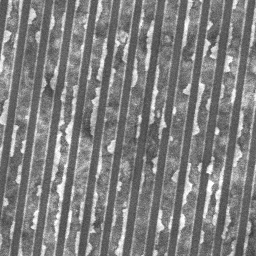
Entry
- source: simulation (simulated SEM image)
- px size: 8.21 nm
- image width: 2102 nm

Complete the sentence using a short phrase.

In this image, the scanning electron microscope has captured parallel lines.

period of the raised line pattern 22.3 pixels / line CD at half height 114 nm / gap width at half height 65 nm